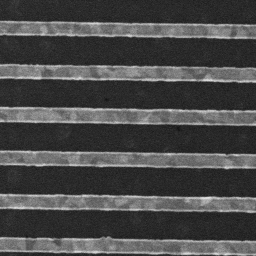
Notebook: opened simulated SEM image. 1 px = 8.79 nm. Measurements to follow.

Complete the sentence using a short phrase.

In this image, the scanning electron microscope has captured parallel lines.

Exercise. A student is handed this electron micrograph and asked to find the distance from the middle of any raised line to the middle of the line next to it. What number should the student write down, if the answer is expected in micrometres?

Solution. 0.381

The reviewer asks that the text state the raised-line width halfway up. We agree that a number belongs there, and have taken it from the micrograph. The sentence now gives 120 nanometers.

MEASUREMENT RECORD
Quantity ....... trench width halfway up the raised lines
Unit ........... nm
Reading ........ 265